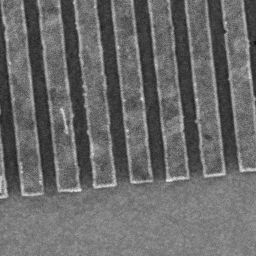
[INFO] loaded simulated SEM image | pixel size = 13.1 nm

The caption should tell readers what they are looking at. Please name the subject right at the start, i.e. parallel lines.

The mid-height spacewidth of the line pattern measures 207 nm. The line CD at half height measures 21.3 pixels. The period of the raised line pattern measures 477 nanometers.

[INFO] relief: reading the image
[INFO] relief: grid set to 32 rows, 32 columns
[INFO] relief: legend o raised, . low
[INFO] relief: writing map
ooo..oo..ooo..ooo..oo..ooo..oo..
ooo..ooo.ooo..ooo..oo..ooo..oo..
ooo..ooo..oo..ooo..oo..ooo..ooo.
.oo..ooo..oo..ooo..ooo..oo..ooo.
.oo..ooo..oo..ooo..ooo..oo..ooo.
.oo..ooo..oo...oo..ooo..oo..ooo.
.oo..ooo..ooo..oo..ooo..oo..ooo.
.ooo..oo..ooo..oo..ooo..ooo.ooo.
.ooo..oo..ooo..oo...oo..ooo..oo.
.ooo..oo..ooo..ooo..oo..ooo..oo.
.ooo..oo...oo..ooo..oo..ooo..oo.
.ooo..ooo..oo..ooo..oo..ooo..ooo
..oo..ooo..oo..ooo..oo..ooo..ooo
..oo..ooo..oo..ooo..ooo..oo..ooo
..oo..ooo..ooo.ooo..ooo..oo..ooo
..oo..ooo..ooo..oo..ooo..oo..ooo
..ooo..oo..ooo..oo..ooo..ooo.ooo
..ooo..oo..ooo..oo..ooo..ooo..oo
..ooo..oo..ooo..oo...oo..ooo..oo
..ooo..oo..ooo..ooo..oo..ooo..oo
..ooo..ooo..oo..ooo..oo..ooo..oo
..ooo..ooo..oo..ooo..oo..ooo....
o..oo..ooo..oo...oo.............
o..oo..ooo......................
o...............................
................................
................................
................................
................................
................................
................................
................................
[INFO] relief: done